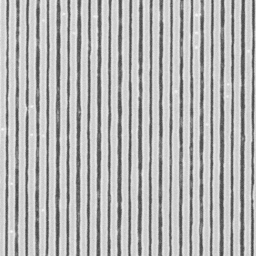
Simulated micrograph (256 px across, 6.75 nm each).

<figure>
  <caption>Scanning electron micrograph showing parallel lines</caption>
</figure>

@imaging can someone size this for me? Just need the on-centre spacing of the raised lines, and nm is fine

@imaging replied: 69.3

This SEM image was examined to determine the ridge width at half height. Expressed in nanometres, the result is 44.7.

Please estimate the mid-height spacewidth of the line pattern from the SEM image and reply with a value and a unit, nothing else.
24.5 nm